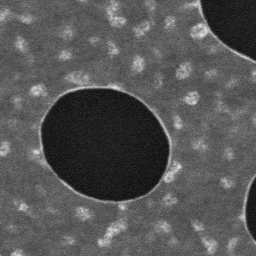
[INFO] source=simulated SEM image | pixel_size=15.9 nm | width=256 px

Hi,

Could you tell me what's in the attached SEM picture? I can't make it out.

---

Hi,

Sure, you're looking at holes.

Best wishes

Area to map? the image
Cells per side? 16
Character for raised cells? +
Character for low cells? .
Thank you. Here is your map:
+++++++++++++...
+++++++++++++...
++++++++++++++..
+++++++++++++++.
++++++++++++++++
++++++++++++++++
+++......+++++++
+++.......++++++
+++.......++++++
+++........+++++
+++.......++++++
++++......++++++
++++++..+++++++.
+++++++++++++++.
++++++++++++++++
++++++++++++++++